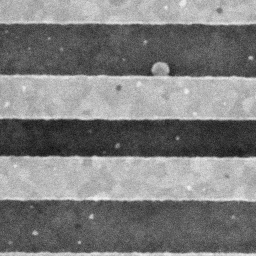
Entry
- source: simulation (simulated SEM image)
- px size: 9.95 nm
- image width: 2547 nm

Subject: lines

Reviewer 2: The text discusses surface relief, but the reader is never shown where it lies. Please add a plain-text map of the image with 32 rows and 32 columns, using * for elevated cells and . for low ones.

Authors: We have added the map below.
********************************
********************************
********************************
................................
................................
................................
................................
................................
................................
********.**.*...................
********************************
********************************
********************************
********************************
********************************
................................
................................
................................
................................
................................
********************************
********************************
********************************
********************************
********************************
................................
................................
................................
................................
................................
................................
................................